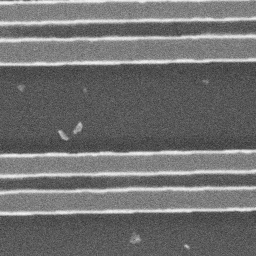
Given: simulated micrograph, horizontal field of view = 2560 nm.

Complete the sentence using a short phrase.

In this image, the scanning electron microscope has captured lines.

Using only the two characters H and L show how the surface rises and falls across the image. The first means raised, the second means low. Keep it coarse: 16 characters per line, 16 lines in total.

HHHHHHHHHHHHHHHH
HHHHHHHHHHHHHHHH
HHHHHHHHHHHHHHHH
HHHHHHHHHHHHHHHH
LLLLLLLLLLLLLLLL
LLLLLLLLLLLLLLLL
LLLLLLLLLLLLLLLL
LLLLLLLLLLLLLLLL
LLLLLLLLLLLLLLLL
LLLLLLLLLLLLHHHH
HHHHHHHHHHHHHHHH
HHHHHHHHHHHHHHHH
HHHHHHHHHHHHHHHH
LLLLLLLLLLLLLLLL
LLLLLLLLLLLLLLLL
LLLLLLLLLLLLLLLL